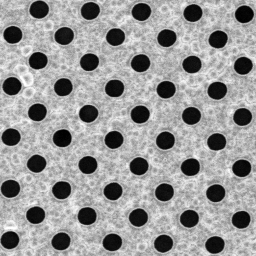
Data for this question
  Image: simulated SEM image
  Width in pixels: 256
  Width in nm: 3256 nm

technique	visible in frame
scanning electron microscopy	a regular array of holes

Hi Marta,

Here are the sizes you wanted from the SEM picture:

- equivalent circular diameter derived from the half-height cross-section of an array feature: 239 nm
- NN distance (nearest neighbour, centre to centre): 459 nm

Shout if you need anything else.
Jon